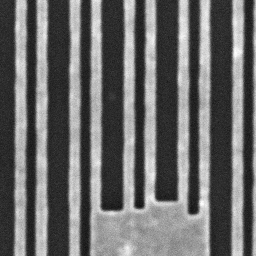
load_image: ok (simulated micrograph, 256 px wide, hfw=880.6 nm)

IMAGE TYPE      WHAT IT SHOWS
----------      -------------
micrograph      groups of lines, slits or small figures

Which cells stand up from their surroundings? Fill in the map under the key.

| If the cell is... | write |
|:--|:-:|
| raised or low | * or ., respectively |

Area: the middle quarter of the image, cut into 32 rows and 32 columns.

..**...**......**....**......**.
..**...**......**....**......**.
..**...**......**....**......**.
..**...**......**....**......**.
..**...**......**....**......**.
..**...**......**....**......**.
..**...**......**....**......**.
..**...**......**....**......**.
..**...**......**...***......**.
..**...**......**...***......**.
..**...**......**....**......**.
..**...**......**....**......**.
..**...**......**....**......**.
..**...**......**....**......**.
..**...**......**...***......**.
..**...**......**...***......**.
..**...**......**...***......**.
..**...**......**...***......**.
..**...**......**...***......**.
..**...**......**...***......**.
..**...**......**...***......**.
..**...**......**....**......**.
..**...**......**....**......**.
..**...**......**....*.......**.
..**...**......**....*.......**.
..**...**......**....*.......**.
..**...**......**....*.......**.
..**...**......**....*.......**.
..**...**......**....*.......**.
..**...**......**....*.......**.
..**...**......**....*.......**.
..**...**......**....*.......**.